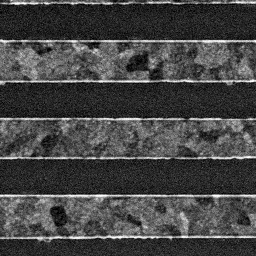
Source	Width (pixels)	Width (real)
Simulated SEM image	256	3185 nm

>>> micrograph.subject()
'lines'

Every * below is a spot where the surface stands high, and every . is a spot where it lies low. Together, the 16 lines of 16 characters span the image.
................
................
................
****************
****************
................
................
****************
****************
****************
................
................
****************
****************
****************
................